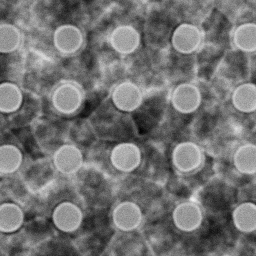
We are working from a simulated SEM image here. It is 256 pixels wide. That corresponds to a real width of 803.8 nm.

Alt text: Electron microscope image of a regular array of raised bodies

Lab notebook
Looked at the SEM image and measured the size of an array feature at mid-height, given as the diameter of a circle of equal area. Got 88.3 nanometers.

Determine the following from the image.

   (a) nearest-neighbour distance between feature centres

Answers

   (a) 183 nanometers